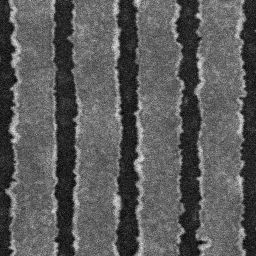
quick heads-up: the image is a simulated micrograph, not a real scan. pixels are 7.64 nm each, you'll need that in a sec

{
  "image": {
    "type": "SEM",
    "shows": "one or a few lines or trenches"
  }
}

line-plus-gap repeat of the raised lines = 477 nanometres